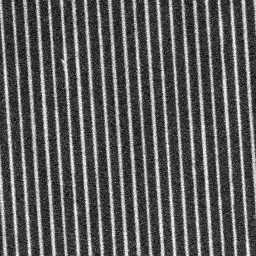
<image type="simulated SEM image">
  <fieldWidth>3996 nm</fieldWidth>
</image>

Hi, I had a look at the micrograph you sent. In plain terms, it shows parallel lines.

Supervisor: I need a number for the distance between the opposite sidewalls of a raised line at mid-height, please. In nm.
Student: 31.2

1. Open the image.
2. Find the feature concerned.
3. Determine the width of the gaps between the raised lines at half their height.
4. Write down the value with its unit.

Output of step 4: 0.15 µm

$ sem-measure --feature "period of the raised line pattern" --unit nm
189